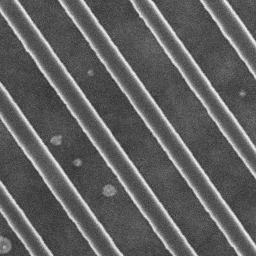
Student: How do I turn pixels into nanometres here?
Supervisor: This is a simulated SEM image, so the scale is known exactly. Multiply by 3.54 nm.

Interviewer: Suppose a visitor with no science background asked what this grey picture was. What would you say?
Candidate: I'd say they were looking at lines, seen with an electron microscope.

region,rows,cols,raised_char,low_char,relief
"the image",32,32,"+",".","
+++.....+++......++......++++...
+++.....+++......+++......+++...
.+++.....+++......+++......+++..
.++++.....+++......++......++++.
..+++......+++.....+++......+++.
...+++.....+++......+++......+++
....+++.....+++......++.......++
....+++......+++.....+++......++
.....+++.....+++......+++......+
......+++.....+++......+++......
......+++......+++.....+++......
+......+++.....+++......+++.....
++......+++.....+++......+++....
++.......+++.....+++......++....
+++......+++......+++.....+++...
.+++......+++.....+++......+++..
.+++.......+++.....+++......+++.
..+++......+++......+++......++.
...+++......+++.....+++......+++
...+++.......+++.....+++......++
....+++......++++.....+++......+
.....+++......+++......+++.....+
......+++......+++.....+++......
+.....+++.......+++.....+++.....
+......+++......+++......+++....
++......+++......+++.....+++....
+++.....+++.......+++.....+++...
.++......+++......+++......+++..
.+++......+++......+++.....+++..
..+++......+++......+++.....+++.
...+++.....+++......++++.....+++
....++......+++......+++......++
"